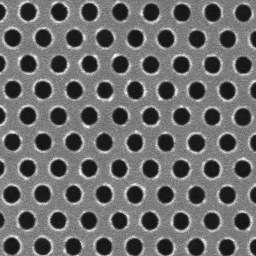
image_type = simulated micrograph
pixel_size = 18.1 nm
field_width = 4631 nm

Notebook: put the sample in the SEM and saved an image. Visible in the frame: a regular array of holes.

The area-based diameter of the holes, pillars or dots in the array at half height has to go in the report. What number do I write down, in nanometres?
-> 317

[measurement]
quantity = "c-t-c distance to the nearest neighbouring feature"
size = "539 nanometres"